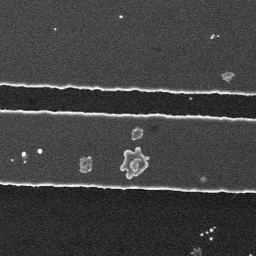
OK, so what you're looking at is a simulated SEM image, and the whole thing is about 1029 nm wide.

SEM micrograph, lines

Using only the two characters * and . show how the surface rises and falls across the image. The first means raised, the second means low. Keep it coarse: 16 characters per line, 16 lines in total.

****************
****************
****************
****************
****************
****************
****************
****************
****************
****************
****************
****************
................
................
................
................